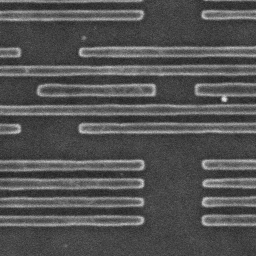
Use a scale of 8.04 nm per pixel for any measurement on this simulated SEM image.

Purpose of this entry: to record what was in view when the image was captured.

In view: wiring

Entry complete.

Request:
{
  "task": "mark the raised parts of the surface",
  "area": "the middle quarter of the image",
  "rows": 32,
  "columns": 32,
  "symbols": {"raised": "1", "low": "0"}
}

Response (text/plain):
00000000000000000000000000000111
11111111111111111111111111111111
11111111111111111111111111111111
00000000000000000000000000000000
00000000000000000000000000000000
11111100001111111111111000000000
11111111111111111111111000000000
11111111111111111111111000000000
00000000000000000000000000000000
00000000000000000000000000000000
00000000001111000000111111100000
11111111111111111111111111111111
11111111111111111111111111111000
00000000000000000000000000000000
00000000000000000000000000000000
00001111111111111111111111111111
00001111111111111111111111111111
00000000000000000000000000000000
00000000000000000000000000000000
00000000000000000000000000000000
00000000000000000000000000000000
00000000000000000000000000000000
00000000000000000000000000000000
00000000000000000000000000000000
11100111111111111111000000000000
11111111111111111111000000000000
00000000000000000000000000000000
00000000000000000000000000000000
00000000000000000000000000000000
11111111111111111111000000000000
11111111111111111111000000000000
00000000000000000000000000000000